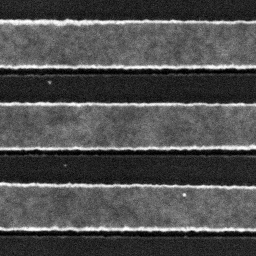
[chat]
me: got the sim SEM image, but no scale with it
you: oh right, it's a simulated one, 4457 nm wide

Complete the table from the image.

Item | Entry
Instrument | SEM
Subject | lines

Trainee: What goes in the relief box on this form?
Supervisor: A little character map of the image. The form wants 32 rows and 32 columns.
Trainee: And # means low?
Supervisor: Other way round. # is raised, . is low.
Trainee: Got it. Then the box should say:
................................
................................
................................
################################
################################
################################
################################
################################
.........#.....#...#.####..#..#.
................................
................................
................................
................................
################################
################################
################################
################################
################################
################################
................................
................................
................................
................................
################################
################################
################################
################################
################################
################################
................................
................................
................................